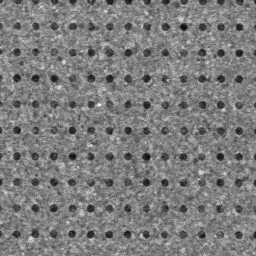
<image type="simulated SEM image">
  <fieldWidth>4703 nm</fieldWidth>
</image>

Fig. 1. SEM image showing a regular array of holes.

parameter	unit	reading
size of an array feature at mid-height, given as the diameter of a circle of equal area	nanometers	161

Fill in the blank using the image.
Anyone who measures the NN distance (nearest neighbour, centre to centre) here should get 0.339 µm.